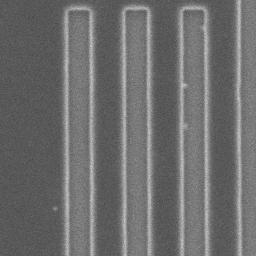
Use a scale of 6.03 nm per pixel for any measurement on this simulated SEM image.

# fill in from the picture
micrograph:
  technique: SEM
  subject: groups of lines, slits or small figures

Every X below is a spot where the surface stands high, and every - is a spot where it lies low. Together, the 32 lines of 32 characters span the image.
XXXXXXXXXXXXXXXXXXXXXXXXXXXXXX--
XXXXXXXX---XXXXX--XXXXX---XXXX--
XXXXXXXX---XXXXX---XXXX---XXXX--
XXXXXXXX---XXXXX---XXXX---XXXX--
XXXXXXXX---XXXXX---XXXX---XXXX--
XXXXXXXX---XXXXX---XXXX---XXXX--
XXXXXXXX---XXXXX---XXXX---XXXX--
XXXXXXXX---XXXXX---XXXX---XXXX--
XXXXXXXX---XXXXX---XXXX---XXXX--
XXXXXXXX---XXXXX---XXXX---XXXX--
XXXXXXXX---XXXXX---XXXX---XXXX--
XXXXXXXX---XXXXX---XXXX---XXXX--
XXXXXXXX---XXXXX---XXXX---XXXX--
XXXXXXXX---XXXXX---XXXX---XXXX--
XXXXXXXX---XXXXX---XXXX---XXXX--
XXXXXXXX---XXXXX---XXXX---XXXX--
XXXXXXXX---XXXXX---XXXX---XXXX--
XXXXXXXX---XXXXX---XXXX---XXXX--
XXXXXXXX---XXXXX---XXXX---XXXX--
XXXXXXXX---XXXXX---XXXX---XXXX--
XXXXXXXX---XXXXX---XXXX---XXXX--
XXXXXXXX---XXXXX---XXXX---XXXX--
XXXXXXXX---XXXXX---XXXX---XXXX--
XXXXXXXX---XXXXX---XXXX---XXXX--
XXXXXXXX---XXXXX---XXXX---XXXX--
XXXXXXXX---XXXXX---XXXX---XXXX--
XXXXXXXX---XXXXX---XXXX---XXXX--
XXXXXXXX---XXXXX---XXXX---XXXX--
XXXXXXXX---XXXXX---XXXX---XXXX--
XXXXXXXX---XXXXX---XXXX---XXXX--
XXXXXXXX---XXXXX---XXXX---XXXX--
XXXXXXXX---XXXXX---XXXX---XXXX--